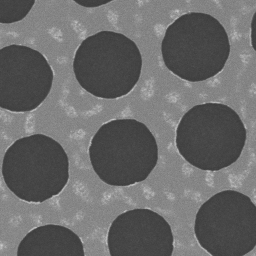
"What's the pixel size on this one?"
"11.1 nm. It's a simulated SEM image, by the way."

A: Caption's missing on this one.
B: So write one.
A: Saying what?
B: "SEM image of holes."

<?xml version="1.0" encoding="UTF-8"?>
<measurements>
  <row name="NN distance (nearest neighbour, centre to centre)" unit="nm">988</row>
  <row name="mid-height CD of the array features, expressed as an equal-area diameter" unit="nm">758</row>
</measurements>